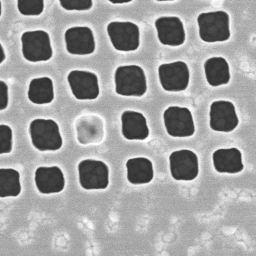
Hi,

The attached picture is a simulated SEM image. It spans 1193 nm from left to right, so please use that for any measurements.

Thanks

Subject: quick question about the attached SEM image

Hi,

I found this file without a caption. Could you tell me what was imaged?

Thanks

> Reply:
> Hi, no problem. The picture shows a regular array of holes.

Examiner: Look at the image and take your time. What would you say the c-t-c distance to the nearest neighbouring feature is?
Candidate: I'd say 204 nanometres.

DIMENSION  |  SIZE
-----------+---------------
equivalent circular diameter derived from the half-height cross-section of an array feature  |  142 nm